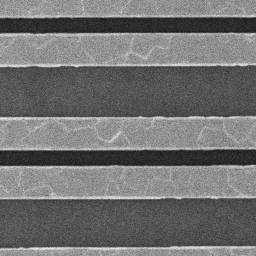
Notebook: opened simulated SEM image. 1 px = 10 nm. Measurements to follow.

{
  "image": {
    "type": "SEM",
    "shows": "lines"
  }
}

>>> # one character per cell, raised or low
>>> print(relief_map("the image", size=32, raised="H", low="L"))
HHHHHHHHHHHHHHHHHHHHHHHHHHHHHHHH
HHHHHHHHHHHHHHHHHHHHHHHHHHHHHHHH
LLLLLLLLLLLLLLLLLLLLLLLLLLLLLLLL
LLLLLLLLLLLLLLLLLLLLLLLLLLLLLLLL
HHHHHHHHHHHHHHHHHHHHHHHHHHHHHHHH
HHHHHHHHHHHHHHHHHHHHHHHHHHHHHHHH
HHHHHHHHHHHHHHHHHHHHHHHHHHHHHHHH
HHHHHHHHHHHHHHHHHHHHHHHHHHHHHHHH
LLLLLLLLLLLLLLLLLLLLLLLLLLLLLLLL
LLLLLLLLLLLLLLLLLLLLLLLLLLLLLLLL
LLLLLLLLLLLLLLLLLLLLLLLLLLLLLLLL
LLLLLLLLLLLLLLLLLLLLLLLLLLLLLLLL
LLLLLLLLLLLLLLLLLLLLLLLLLLLLLLLL
LLLLLLLLLLLLLLLLLLLLLLLLLLLLLLLL
LLLLLLLLLLLLLLLLLLLLLLLLLLLLLLLL
HHHHHHHHHHHHHHHHHHHHHHHHHHHHHHHH
HHHHHHHHHHHHHHHHHHHHHHHHHHHHHHHH
HHHHHHHHHHHHHHHHHHHHHHHHHHHHHHHH
HHHHHHHHHHHHHHHHHHHHHHHHHHHHHHHH
LLLLLLLLLLLLLLLLLLLLLLLLLLLLLLLL
LLLLLLLLLLLLLLLLLLLLLLLLLLLLLLLL
HHHHHHHHHHHHHHHHHHHHHHHHHHHHHHHH
HHHHHHHHHHHHHHHHHHHHHHHHHHHHHHHH
HHHHHHHHHHHHHHHHHHHHHHHHHHHHHHHH
HHHHHHHHHHHHHHHHHHHHHHHHHHHHHHHH
LLLLLLLLLLLLLLLLLLLLLLLLLLLLLLLL
LLLLLLLLLLLLLLLLLLLLLLLLLLLLLLLL
LLLLLLLLLLLLLLLLLLLLLLLLLLLLLLLL
LLLLLLLLLLLLLLLLLLLLLLLLLLLLLLLL
LLLLLLLLLLLLLLLLLLLLLLLLLLLLLLLL
LLLLLLLLLLLLLLLLLLLLLLLLLLLLLLLL
HHHHHHHHHHHHHHHHHHHHHHHHHHHHHHHH